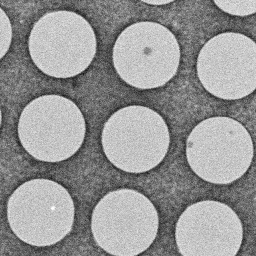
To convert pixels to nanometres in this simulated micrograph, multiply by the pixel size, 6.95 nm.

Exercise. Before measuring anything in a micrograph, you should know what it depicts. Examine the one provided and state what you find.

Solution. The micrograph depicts an array of small figures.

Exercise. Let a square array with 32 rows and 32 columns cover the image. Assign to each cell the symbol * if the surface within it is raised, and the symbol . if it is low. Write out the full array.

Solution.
...................*.......*****
.......**...................****
*....******.....................
*...*******.....*****...........
*...********...*******.....****.
*...********..********....******
*...********..********...*******
....*******...********...*******
.....******...********...*******
.......**......*******...*******
................****.....*******
..........................*****.
....*****.......................
...*******......**..............
...*******....******............
..*********..********....*****..
..*********..********...*******.
...*******...********..********.
...*******...********..*********
....*****....********..*********
..............******....*******.
................**......*******.
....**....................***...
..******........................
..*******....*****..............
.********...*******.....****....
.********...********...******...
.********..*********..********..
.********..*********..********..
..******....*******...********..
....**......*******...********..
.............*****.....*******..